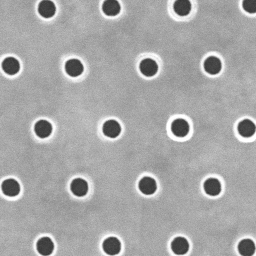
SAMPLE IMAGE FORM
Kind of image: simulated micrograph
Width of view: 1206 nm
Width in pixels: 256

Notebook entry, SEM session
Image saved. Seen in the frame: a regular array of holes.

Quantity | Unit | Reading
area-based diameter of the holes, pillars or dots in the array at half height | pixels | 20.5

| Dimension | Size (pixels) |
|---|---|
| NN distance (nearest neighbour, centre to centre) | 66.3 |